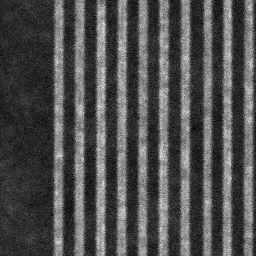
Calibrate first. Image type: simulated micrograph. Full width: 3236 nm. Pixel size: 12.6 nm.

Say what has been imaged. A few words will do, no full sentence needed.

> parallel lines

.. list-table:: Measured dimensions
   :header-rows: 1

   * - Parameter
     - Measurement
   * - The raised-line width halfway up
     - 74.3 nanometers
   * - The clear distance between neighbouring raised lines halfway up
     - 199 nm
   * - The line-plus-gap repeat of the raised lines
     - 266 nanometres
